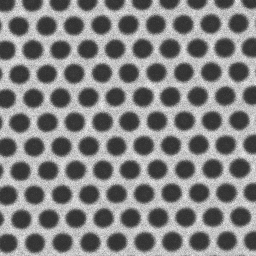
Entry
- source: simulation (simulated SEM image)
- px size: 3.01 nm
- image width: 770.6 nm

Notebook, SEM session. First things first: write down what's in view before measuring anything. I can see a regular array of holes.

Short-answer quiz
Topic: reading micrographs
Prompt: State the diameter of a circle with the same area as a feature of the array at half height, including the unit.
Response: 57.2 nm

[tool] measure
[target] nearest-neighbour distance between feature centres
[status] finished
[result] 0.0818 micrometres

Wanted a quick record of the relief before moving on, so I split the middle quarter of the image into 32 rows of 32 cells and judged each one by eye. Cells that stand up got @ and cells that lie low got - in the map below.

@---@@@@---@@@@---@@@----@@@----
-----@@-----@@-----@@----@@@----
-----@@-----@@-----@@-----@@----
-----@@-----@@----@@@----@@@----
@---@@@@@-@@@@@--@@@@@--@@@@@@@@
@@@@@@@@@@@@@@@@@@@@@@@@@@@@@@@@
-@@@@---@@@@--@@@@----@@@---@@@@
-@@@----@@@----@@@----@@-----@@-
--@@----@@-----@@-----@@-----@@-
--@@----@@@----@@@----@@@----@@-
-@@@@--@@@@@-@@@@@@--@@@@@-@@@@@
@@@@@@@@@@@@@@@@@@@@@@@@@@@@@@@@
@---@@@@---@@@@---@@@----@@@@---
-----@@-----@@-----@@-----@@----
-----@@-----@@-----@@-----@@----
-----@@-----@@-----@@----@@@----
@---@@@@---@@@@---@@@@--@@@@@@@@
@@@@@@@@@@@@@@@@@@@@@@@@@@@@@@@@
@@@@@--@@@@@--@@@@----@@@---@@@@
--@@----@@@----@@@----@@@----@@-
--@@-----@@-----@-----@@-----@@-
--@@----@@@----@@@----@@@----@@@
-@@@@---@@@@---@@@@--@@@@@--@@@@
@@@@@@@@@@@@@@@@@@@@@@@@@@@@@@@@
@@--@@@@@--@@@@---@@@@---@@@@---
@----@@@----@@-----@@-----@@----
@-----@-----@@-----@@-----@@----
@----@@@----@@-----@@----@@@----
@---@@@@---@@@@---@@@@@-@@@@@--@
@@@@@@@@@@@@@@@@@@@@@@@@@@@@@@@@
-@@@@@-@@@@@--@@@@@--@@@@----@@@
--@@----@@@----@@@----@@@----@@-